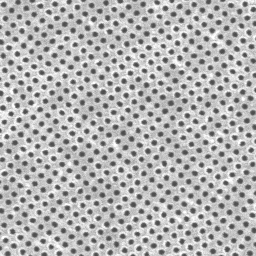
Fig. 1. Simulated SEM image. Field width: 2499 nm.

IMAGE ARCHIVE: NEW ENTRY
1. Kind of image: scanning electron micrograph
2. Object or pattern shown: a regular array of holes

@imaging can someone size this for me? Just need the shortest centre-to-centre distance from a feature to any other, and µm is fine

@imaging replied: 0.097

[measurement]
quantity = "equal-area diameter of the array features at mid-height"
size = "61.3 nm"